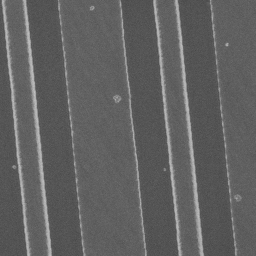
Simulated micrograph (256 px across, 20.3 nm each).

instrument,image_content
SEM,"lines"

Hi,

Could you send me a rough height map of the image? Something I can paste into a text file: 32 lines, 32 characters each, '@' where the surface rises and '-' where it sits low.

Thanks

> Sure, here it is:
@@@----@@@@@@@@----@@@----@@@@@@
@@@----@@@@@@@@----@@@----@@@@@@
-@@----@@@@@@@@----@@@-----@@@@@
-@@@----@@@@@@@-----@@-----@@@@@
-@@@----@@@@@@@-----@@@----@@@@@
-@@@----@@@@@@@@----@@@----@@@@@
-@@@----@@@@@@@@----@@@----@@@@@
-@@@----@@@@@@@@----@@@----@@@@@
-@@@----@@@@@@@@----@@@----@@@@@
-@@@----@@@@@@@@----@@@----@@@@@
-@@@----@@@@@@@@----@@@----@@@@@
-@@@----@@@@@@@@----@@@----@@@@@
--@@-----@@@@@@@----@@@-----@@@@
--@@@----@@@@@@@-----@@@----@@@@
--@@@----@@@@@@@-----@@@----@@@@
--@@@----@@@@@@@@----@@@----@@@@
--@@@----@@@@@@@@----@@@----@@@@
--@@@----@@@@@@@@----@@@----@@@@
--@@@----@@@@@@@@----@@@----@@@@
--@@@----@@@@@@@@----@@@----@@@@
--@@@----@@@@@@@@----@@@----@@@@
--@@@----@@@@@@@@----@@@----@@@@
--@@@-----@@@@@@@-----@@-----@@@
---@@@----@@@@@@@-----@@@----@@@
---@@@----@@@@@@@-----@@@----@@@
---@@@----@@@@@@@@----@@@----@@@
---@@@----@@@@@@@@----@@@----@@@
---@@@----@@@@@@@@----@@@----@@@
---@@@----@@@@@@@@----@@@----@@@
---@@@----@@@@@@@@----@@@----@@@
---@@@----@@@@@@@@----@@@----@@@
---@@@----@@@@@@@@----@@@----@@@